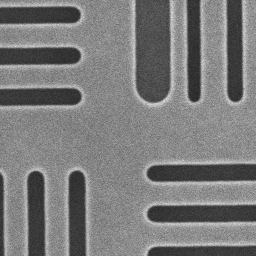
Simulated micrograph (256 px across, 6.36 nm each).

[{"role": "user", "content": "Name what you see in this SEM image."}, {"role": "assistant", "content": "groups of lines, slits or small figures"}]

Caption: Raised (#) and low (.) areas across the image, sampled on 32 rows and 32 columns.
#################....##..###..##
..........#######....##..###..##
..........#######....##..###..##
#################....##..###..##
#################....##..###..##
#################....##..###..##
..........#######....##..###..##
..........#######....##..###..##
#################....##..###..##
#################....##..###..##
#################....##..###..##
..........#######....##..###..##
..........########..####.####.##
################################
################################
################################
################################
################################
################################
################################
###########################.....
####.####.########..............
###...###..########.............
###...###..#####################
###...##...#####################
###...##...#####################
###...###..#######..............
###...###..########.............
###...###..#####################
###...###..#####################
.##...###..#####################
.##...###..########.............